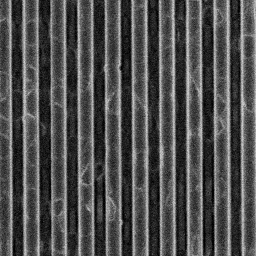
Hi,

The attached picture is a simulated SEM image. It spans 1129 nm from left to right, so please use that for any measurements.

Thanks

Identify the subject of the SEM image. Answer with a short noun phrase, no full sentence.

parallel lines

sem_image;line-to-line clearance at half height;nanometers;55.6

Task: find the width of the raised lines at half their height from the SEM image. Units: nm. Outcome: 64.4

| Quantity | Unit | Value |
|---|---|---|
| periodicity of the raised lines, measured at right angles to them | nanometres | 120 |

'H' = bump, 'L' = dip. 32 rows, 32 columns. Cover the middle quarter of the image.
LLLLHHHLLLHHHHLLLHHHHLLLHHHHLLLH
LLLLHHHLLLHHHHLLLHHHHLLLHHHHLLLH
LLLLHHHLLLLHHHLLLHHHHLLLHHHHLLLH
LLLLHHHLLLLHHHLLLHHHHLLLHHHHLLLH
LLLLHHHLLLLHHHLLLHHHHLLLHHHHLLLH
LLLLHHHLLLLHHHLLLHHHHLLLHHHHLLLH
LLLLHHHLLLLHHHLLLHHHHLLLHHHHLLLH
LLLLHHHLLLLHHHLLLHHHHLLLHHHHLLLH
LLLLHHHLLLLHHHLLLHHHHLLLHHHHLLLH
LLLLHHHLLLLHHHLLLHHHHLLLHHHHLLLH
LLLLHHHLLLLHHHLLLHHHHLLLHHHHLLLH
LLLLHHHLLLLHHHLLLHHHHLLLHHHHLLLH
LLLLHHHLLLLHHHLLLHHHHLLLHHHHLLLH
LLLLHHHLLLLHHHLLLHHHHLLLHHHHLLLH
LLLLHHHLLLLHHHLLLHHHHLLLHHHHLLLH
LLLLHHHLLLLHHHLLLHHHHLLLHHHHLLLH
LLLLHHHLLLLHHHLLLHHHHLLLHHHHLLLH
LLLLHHHLLLLHHHLLLHHHHLLLHHHHLLLH
LLLLHHHLLLLHHHLLLHHHHLLLHHHHLLLH
LLLLHHHLLLLHHHLLLHHHHLLLHHHHLLLH
LLLLHHHLLLLHHHLLLHHHHLLLHHHHLLLH
LLLLHHHLLLLHHHLLLHHHHLLLHHHHLLLH
LLLLHHHLLLLHHHLLLHHHHLLLHHHHLLLH
LLLLHHHLLLLHHHLLLHHHHLLLHHHHLLLH
LLLLHHHLLLLHHHLLLHHHHLLLHHHHLLLH
LLLLHHHLLLLHHHLLLHHHHLLLHHHHLLLH
LLLLHHHLLLLHHHLLLHHHHLLLHHHHLLLH
LLLLHHHLLLLHHHLLLHHHHLLLHHHHLLLH
LLLLHHHLLLLHHHLLLHHHHLLLHHHHLLLH
LLLLHHHLLLLHHHLLLHHHHLLLHHHHLLLH
LLLLHHHLLLLHHHLLLHHHHLLLHHHHLLLH
LLLLHHHLLLLHHHLLLHHHHLLLHHHHLLLH